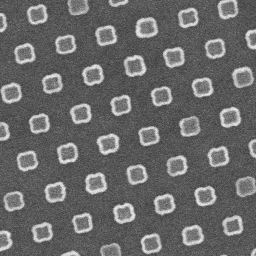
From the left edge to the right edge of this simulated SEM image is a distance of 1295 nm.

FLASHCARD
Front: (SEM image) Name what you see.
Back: a regular array of raised bodies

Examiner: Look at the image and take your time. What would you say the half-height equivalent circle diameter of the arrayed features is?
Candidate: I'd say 0.103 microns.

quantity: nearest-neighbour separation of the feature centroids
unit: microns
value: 0.206